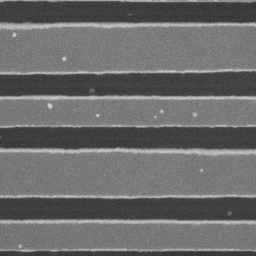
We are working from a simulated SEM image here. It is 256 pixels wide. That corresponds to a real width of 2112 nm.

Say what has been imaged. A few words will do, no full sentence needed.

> lines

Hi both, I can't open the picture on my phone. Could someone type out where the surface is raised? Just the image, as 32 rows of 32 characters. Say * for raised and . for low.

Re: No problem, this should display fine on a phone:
................................
................................
................................
********************************
********************************
********************************
********************************
********************************
********************************
................................
................................
................................
********************************
********************************
********************************
********************************
................................
................................
................................
********************************
********************************
********************************
********************************
********************************
********************************
................................
................................
................................
********************************
********************************
********************************
................................